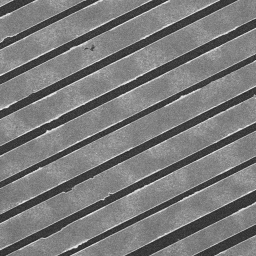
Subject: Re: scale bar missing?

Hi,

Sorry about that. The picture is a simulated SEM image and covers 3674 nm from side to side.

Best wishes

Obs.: parallel lines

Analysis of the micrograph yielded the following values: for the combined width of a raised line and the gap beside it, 0.444 microns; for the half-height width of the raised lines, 327 nanometers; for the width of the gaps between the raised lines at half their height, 117 nanometers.